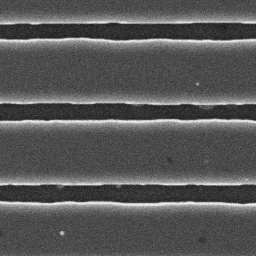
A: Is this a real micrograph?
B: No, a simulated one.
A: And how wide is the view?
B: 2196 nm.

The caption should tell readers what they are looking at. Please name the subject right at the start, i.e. lines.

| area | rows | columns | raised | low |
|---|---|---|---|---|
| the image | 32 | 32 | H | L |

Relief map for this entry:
HHHHHHHHHHHHHHHHHHHHHHHHHHHHHHHH
HHHHHHHHHHHHHHHHHHHHHHHHHHHHHHHH
HHHHHHHHHHHHHHHHHHHHHHHHHHHHHHHH
LLLLLLLLLLLLLLLLLLLLLLLLLLLLLLLL
LLLLLLLLLLLLLLLLLLLLLLLLLLLLLLLL
HHHHHHHHHHHHHHHHHHHHHHHHHHHHHHHH
HHHHHHHHHHHHHHHHHHHHHHHHHHHHHHHH
HHHHHHHHHHHHHHHHHHHHHHHHHHHHHHHH
HHHHHHHHHHHHHHHHHHHHHHHHHHHHHHHH
HHHHHHHHHHHHHHHHHHHHHHHHHHHHHHHH
HHHHHHHHHHHHHHHHHHHHHHHHHHHHHHHH
HHHHHHHHHHHHHHHHHHHHHHHHHHHHHHHH
HHHHHHHHHHHHHHHHHHHHHHHHHHHHHHHH
LLLLLLLLLLLLLLLLLLLLLLLLLLLLLLLL
LLLLLLLLLLLLLLLLLLLLLLLLLLLLLLLL
HHHHHHHHHHHHHHHHHHHHHHHHHHHHHHHH
HHHHHHHHHHHHHHHHHHHHHHHHHHHHHHHH
HHHHHHHHHHHHHHHHHHHHHHHHHHHHHHHH
HHHHHHHHHHHHHHHHHHHHHHHHHHHHHHHH
HHHHHHHHHHHHHHHHHHHHHHHHHHHHHHHH
HHHHHHHHHHHHHHHHHHHHHHHHHHHHHHHH
HHHHHHHHHHHHHHHHHHHHHHHHHHHHHHHH
HHHHHHHHHHHHHHHHHHHHHHHHHHHHHHHH
LLLLLLLLLLLLLLLLLLLLLLLLLLLLLLLL
LLLLLLLLLLLLLLLLLLLLLLLLLLLLLLLL
HHHHHHHHHHHHHHHHLLLLHHHHHHHHHLLL
HHHHHHHHHHHHHHHHHHHHHHHHHHHHHHHH
HHHHHHHHHHHHHHHHHHHHHHHHHHHHHHHH
HHHHHHHHHHHHHHHHHHHHHHHHHHHHHHHH
HHHHHHHHHHHHHHHHHHHHHHHHHHHHHHHH
HHHHHHHHHHHHHHHHHHHHHHHHHHHHHHHH
HHHHHHHHHHHHHHHHHHHHHHHHHHHHHHHH